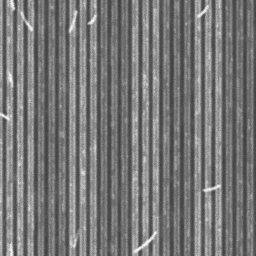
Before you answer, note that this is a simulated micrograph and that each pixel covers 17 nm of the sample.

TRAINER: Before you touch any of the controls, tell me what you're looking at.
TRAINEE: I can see parallel lines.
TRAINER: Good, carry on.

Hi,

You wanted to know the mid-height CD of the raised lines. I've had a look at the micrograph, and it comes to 0.0871 microns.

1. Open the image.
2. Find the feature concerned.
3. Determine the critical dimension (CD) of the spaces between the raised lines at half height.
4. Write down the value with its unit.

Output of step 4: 0.0892 micrometres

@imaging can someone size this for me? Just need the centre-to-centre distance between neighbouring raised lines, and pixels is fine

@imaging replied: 10.4